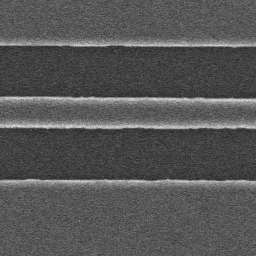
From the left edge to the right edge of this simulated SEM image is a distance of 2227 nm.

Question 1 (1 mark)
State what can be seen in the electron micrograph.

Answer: lines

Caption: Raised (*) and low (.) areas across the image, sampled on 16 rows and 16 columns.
****************
****************
****************
................
................
................
****************
****************
................
................
................
****************
****************
****************
****************
****************